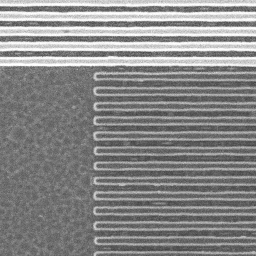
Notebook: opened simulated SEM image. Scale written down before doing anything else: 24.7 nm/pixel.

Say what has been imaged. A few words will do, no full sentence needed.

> parallel lines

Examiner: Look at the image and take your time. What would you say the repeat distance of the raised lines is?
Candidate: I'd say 370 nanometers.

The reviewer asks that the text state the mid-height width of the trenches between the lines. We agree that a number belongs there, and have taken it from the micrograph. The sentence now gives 189 nanometres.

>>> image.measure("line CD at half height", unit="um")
0.185